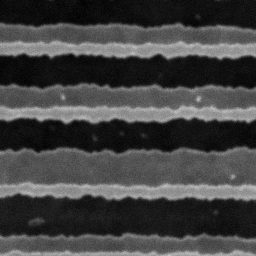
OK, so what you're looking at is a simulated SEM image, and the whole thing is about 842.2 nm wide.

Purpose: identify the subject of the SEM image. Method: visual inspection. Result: lines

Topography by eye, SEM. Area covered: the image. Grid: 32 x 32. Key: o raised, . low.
................................
................................
................................
oooooooooooooooooo.ooooo.ooooo..
oooooooooooooooooooooooooooooooo
oooooooooooooooooooooooooooooooo
oooooooooooooooooooooooooooooooo
................................
................................
................................
................................
oooooooooooooooooooooooooooooooo
oooooooooooooooooooooooooooooooo
oooooooooooooooooooooooooooooooo
oooooooooooooooooooooooooooooooo
................................
................................
................................
..............................o.
oooooooooooooooooooooooooooooooo
oooooooooooooooooooooooooooooooo
oooooooooooooooooooooooooooooooo
oooooooooooooooooooooooooooooooo
oooooooooooooooooooooooooooooooo
o...o..ooo...ooooooooooooooooooo
................................
................................
................................
................................
..........oo...oo........o......
oooooooooooooooooooooooooooooooo
oooooooooooooooooooooooooooooooo